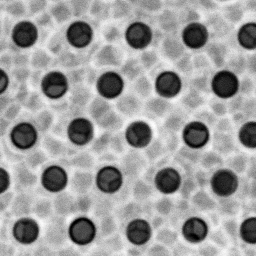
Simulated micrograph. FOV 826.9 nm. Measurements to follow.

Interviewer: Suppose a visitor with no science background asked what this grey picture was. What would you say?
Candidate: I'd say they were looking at a regular array of holes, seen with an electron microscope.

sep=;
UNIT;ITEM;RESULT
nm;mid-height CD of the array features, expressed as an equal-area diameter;91.3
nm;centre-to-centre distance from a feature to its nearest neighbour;177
